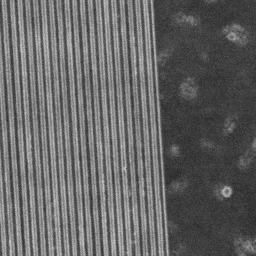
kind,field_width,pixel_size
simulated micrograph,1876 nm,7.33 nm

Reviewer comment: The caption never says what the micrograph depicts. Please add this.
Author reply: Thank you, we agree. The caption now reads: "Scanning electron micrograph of parallel lines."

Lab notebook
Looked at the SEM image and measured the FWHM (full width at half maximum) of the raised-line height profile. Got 0.0283 micrometres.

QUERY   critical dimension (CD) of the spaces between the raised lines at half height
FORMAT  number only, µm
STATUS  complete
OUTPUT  0.0283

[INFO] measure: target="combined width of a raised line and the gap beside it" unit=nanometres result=57.3